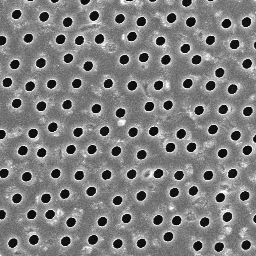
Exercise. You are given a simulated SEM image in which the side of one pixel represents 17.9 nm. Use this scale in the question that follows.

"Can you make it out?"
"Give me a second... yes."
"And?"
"a regular array of holes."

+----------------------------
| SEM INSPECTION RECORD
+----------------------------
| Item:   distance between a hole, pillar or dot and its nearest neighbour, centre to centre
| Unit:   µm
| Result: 0.366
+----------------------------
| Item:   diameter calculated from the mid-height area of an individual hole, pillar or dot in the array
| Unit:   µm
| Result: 0.173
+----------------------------